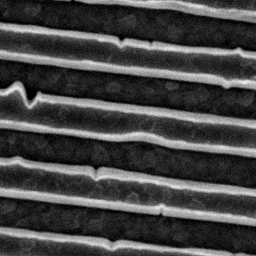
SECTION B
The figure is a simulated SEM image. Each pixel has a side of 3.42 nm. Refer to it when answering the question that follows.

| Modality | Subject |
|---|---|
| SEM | one or a few lines or trenches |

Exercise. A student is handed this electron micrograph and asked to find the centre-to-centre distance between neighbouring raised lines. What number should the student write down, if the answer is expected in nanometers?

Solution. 232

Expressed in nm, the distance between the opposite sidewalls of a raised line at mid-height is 107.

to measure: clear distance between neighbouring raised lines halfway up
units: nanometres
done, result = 123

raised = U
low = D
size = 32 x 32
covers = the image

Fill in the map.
DDDDDDDDDDDDDDDDUUUUUUUUUUUUUUUU
DDDDDDDDDDDDDDDDDDDDDDDDDDUUUUUU
DDDDDDDDDDDDDDDDDDDDDDDDDDDDDDDD
UUUDDDDDDDDDDDDDDDDDDDDDDDDDDDDD
UUUUUUUUUUUUDDDDDDDDDDDDDDDDDDDD
UUUUUUUUUUUUUUUUUUDDDDDDDDDDDDDD
UUUUUUUUUUUUUUUUUUUUUUUUUUUUUUDD
DDDDUUUUUUUUUUUUUUUUUUUUUUUUUUUU
DDDDDDDDDDDDUUUUUUUUUUUUUUUUUUUU
DDDDDDDDDDDDDDDDDDDDDDUUUUUUUUUU
DDDDDDDDDDDDDDDDDDDDDDDDDDDDUUUU
UUUDDDDDDDDDDDDDDDDDDDDDDDDDDDDD
UUUDUUUUUDDDDDDDDDDDDDDDDDDDDDDD
UUUUUUUUUUUUUUUUUDDDDDDDDDDDDDDD
UUUUUUUUUUUUUUUUUUUUUUUUDDDDDDDD
UUUUUUUUUUUUUUUUUUUUUUUUUUUUUUUU
DDDDDDDUUUUUUUUUUUUUUUUUUUUUUUUU
DDDDDDDDDDDDDDDDDDDUUUUUUUUUUUUU
DDDDDDDDDDDDDDDDDDDDDDDDDUUUUUUU
DDDDDDDDDDDDDDDDDDDDDDDDDDDDDDDD
UUUUDDDDDDDDDDDDDDDDDDDDDDDDDDDD
UUUUUUUUUUUDDUDDDDDDDDDDDDDDDDDD
UUUUUUUUUUUUUUUUUUUUDDDDDDDDDDDD
UUUUUUUUUUUUUUUUUUUUUUUUUUUDDDDD
DDDUUUUUUUUUUUUUUUUUUUUUUUUUUUUU
DDDDDDDDDDDDUUUUUUUUUUUUUUUUUUUU
DDDDDDDDDDDDDDDDDDDDDUUUUUUUUUUU
DDDDDDDDDDDDDDDDDDDDDDDDDDDDDUUU
DDDDDDDDDDDDDDDDDDDDDDDDDDDDDDDD
UUUUUDDDDDDDDDDDDDDDDDDDDDDDDDDD
UUUUUUUUUUUUUDDUUDDDDDDDDDDDDDDD
UUUUUUUUUUUUUUUUUUUUUUUUUUUDDDDD